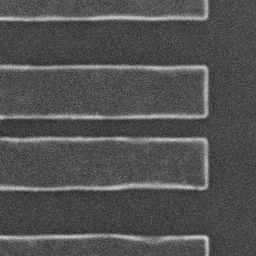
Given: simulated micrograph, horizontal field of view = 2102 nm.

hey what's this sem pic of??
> wiring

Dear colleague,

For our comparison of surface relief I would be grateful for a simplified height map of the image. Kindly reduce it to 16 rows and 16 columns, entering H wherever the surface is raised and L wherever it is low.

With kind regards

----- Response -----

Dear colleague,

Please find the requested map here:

HHHHHHHHHHHHHLLL
LLLLLLLLLLLLLLLL
LLLLLLLLLLLLLLLL
LLLLLLLLLLLLLLLL
HHHHHHHHHHHHHLLL
HHHHHHHHHHHHHLLL
HHHHHHHHHHHHHLLL
LLLLLLLLLLLLLLLL
LLLLLLLLLLLLLLLL
HHHHHHHHHHHHHLLL
HHHHHHHHHHHHHLLL
HHHHHHHHHHHHHLLL
LLLLLLLLLLLLLLLL
LLLLLLLLLLLLLLLL
LLLLLLLLLLLLLLLL
HHHHHHHHHHHHHLLL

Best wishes